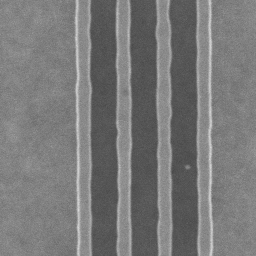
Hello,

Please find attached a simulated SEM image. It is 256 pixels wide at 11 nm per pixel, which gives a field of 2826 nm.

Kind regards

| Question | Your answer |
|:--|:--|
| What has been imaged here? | groups of lines, slits or small figures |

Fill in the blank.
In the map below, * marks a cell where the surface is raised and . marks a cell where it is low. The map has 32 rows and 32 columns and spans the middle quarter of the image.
...***.......***.......***......
...***.......***.......***......
....**........**.......***......
....**........**.......***......
...****.......**.......***......
...****.......**.......****.....
...****.......**.......****.....
...****.......**.......****.....
...****.......***......***......
...****.......***......***......
...****......****......****.....
...****......****......****.....
...****......****......****.....
....***......***.......****.....
...****......***.......***......
...****......***........**......
...****.......**........**......
...***........**........**......
....***......****.......**......
....***......****.......**......
....***......****.......***.....
....***.......***......****.....
....***.......**.......****.....
....***.......**.......****.....
....***.......**........***.....
....***.......**........**......
....***.......**........**......
....***.......**........***.....
....***.......**........***.....
....***.......**........***.....
....***.......**........***.....
....***.......**........***.....